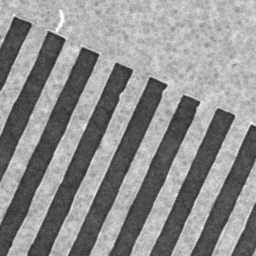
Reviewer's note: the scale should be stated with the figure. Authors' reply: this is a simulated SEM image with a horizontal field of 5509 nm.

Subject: parallel lines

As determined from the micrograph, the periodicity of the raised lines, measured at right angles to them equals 799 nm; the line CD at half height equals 354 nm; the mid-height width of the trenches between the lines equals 438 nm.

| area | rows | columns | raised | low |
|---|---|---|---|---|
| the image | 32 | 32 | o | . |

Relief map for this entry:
oooooooooooooooooooooooooooooooo
oooooooooooooooooooooooooooooooo
o..ooooooooooooooooooooooooooooo
o...oooooooooooooooooooooooooooo
o..ooo..oooooooooooooooooooooooo
...oo...oooooooooooooooooooooooo
...oo...oo..oooooooooooooooooooo
..oo...ooo..oooooooooooooooooooo
..oo...oo...oo..oooooooooooooooo
.oo...ooo..ooo...ooooooooooooooo
.oo...oo...oo...oo...ooooooooooo
oo...ooo..ooo..ooo...ooooooooooo
oo...oo...oo...oo...oo...ooooooo
o...ooo..ooo...oo...oo...oo.oooo
o...oo...oo...oo...ooo..ooo..ooo
o..ooo...oo...oo...oo...oo...ooo
...oo...oo...ooo..ooo..ooo...oo.
...oo...oo...oo...oo...oo...oo..
..oo...oo...ooo..ooo...oo...oo..
..oo...oo...oo...oo...oo...oo...
.oo...ooo..ooo..ooo...oo...oo...
.oo...oo...oo...oo...oo...ooo..o
ooo..ooo..ooo...oo...oo...oo...o
oo...oo...oo...oo...oo...ooo..oo
oo..ooo..ooo...oo...oo...oo...oo
o...oo...oo...oo...ooo..ooo...oo
o...oo...oo...oo...oo...oo...oo.
...oo...oo...ooo..ooo..ooo...oo.
...oo...oo...oo...oo...oo...oo..
..oo...ooo..ooo..ooo...oo...oo..
..oo...oo...oo...oo...oo...oo...
.oo...ooo..ooo...oo...oo...oo...